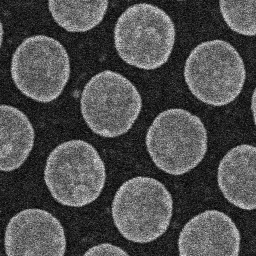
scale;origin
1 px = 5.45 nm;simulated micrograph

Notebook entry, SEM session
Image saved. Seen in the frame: raised bodies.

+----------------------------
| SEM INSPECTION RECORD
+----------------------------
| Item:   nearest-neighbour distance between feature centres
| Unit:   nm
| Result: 416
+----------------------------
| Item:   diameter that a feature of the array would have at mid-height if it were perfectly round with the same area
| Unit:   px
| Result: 62.1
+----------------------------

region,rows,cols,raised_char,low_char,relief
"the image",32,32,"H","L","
LLLLLLHHHHHHHLLLLLLLLLLLLLLHHHHH
LLLLLLHHHHHHHLLLHHHHLLLLLLLLHHHH
LLLLLLLHHHHHHLLHHHHHHLLLLLLLHHHH
LLLLLLLLHHHLLLHHHHHHHHLLLLLLLHHH
LLLLLLLLLLLLLLHHHHHHHHLLLLLLLLLL
LLLHHHHLLLLLLLHHHHHHHHLLLHHHHLLL
LLHHHHHHLLLLLLLHHHHHHLLLHHHHHHLL
LLHHHHHHHLLLLLLLHHHHHLLHHHHHHHLL
LHHHHHHHHLLLLLLLLLHLLLLHHHHHHHLL
LLHHHHHHHLLLHHHLLLLLLLLHHHHHHHHL
LLHHHHHHLLLHHHHHLLLLLLLLHHHHHHLL
LLLHHHHHLLHHHHHHHLLLLLLLHHHHHHLL
LLLLLHLLLLHHHHHHHHLLLLLLLHHHHLLL
HHLLLLLLLLHHHHHHHHLLLLLLLLLLLLLL
HHHLLLLLLLHHHHHHHLLLHHHHLLLLLLLL
HHHHLLLLLLLHHHHHHLLHHHHHHLLLLLLL
HHHHLLLLLLLLHHHHLLHHHHHHHHLLLLLL
HHHHLLLLLLLLLLLLLLHHHHHHHHLLLLLL
HHHHLLLHHHHHLLLLLLHHHHHHHHLLLHHH
HHHLLLHHHHHHLLLLLLLHHHHHHLLLHHHH
HHHLLLHHHHHHHLLLLLLHHHHHHLLLHHHH
LLLLLLHHHHHHHLLLLLLLLHHLLLLHHHHH
LLLLLLHHHHHHHLLLHHHLLLLLLLLHHHHH
LLLLLLHHHHHHHLLHHHHHHLLLLLLLHHHH
LLLLLLLHHHHHLLHHHHHHHLLLLLLLHHHH
LLLLLLLLHHHLLLHHHHHHHHLLLLLLLHHH
LLLHHHLLLLLLLLHHHHHHHLLLLLHLLLLL
LHHHHHHLLLLLLLHHHHHHHLLLHHHHHLLL
LHHHHHHHLLLLLLLHHHHHHLLHHHHHHHLL
LHHHHHHHLLLLLLLLHHHHLLHHHHHHHHLL
LHHHHHHHLLLLLHLLLLLLLLHHHHHHHHLL
LHHHHHHHLLLHHHHHLLLLLLHHHHHHHHLL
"